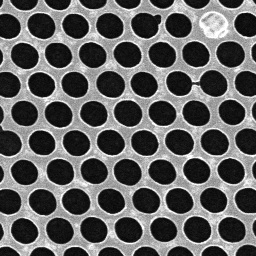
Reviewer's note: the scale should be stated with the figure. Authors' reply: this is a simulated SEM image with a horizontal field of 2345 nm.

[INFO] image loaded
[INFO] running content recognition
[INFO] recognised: a regular array of holes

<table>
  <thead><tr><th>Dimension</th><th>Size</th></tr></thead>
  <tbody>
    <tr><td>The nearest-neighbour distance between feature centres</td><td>305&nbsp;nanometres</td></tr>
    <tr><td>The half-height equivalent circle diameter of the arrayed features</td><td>244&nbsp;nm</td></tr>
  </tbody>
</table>